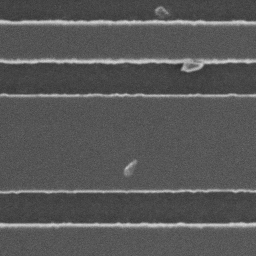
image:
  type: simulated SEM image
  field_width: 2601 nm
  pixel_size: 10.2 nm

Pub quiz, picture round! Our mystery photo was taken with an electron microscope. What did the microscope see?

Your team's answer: lines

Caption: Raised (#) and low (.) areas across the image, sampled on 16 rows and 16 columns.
................
################
################
################
................
................
################
################
################
################
################
################
................
................
################
################